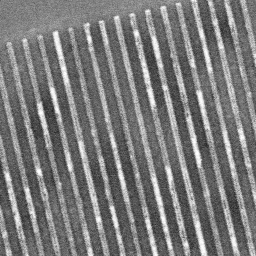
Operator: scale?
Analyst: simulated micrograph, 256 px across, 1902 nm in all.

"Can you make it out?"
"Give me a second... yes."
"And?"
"parallel lines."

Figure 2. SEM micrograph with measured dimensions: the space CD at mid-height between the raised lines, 87.7 nanometres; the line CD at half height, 30.7 nm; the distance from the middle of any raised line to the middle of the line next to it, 118 nm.